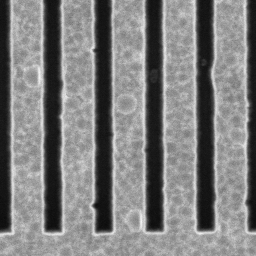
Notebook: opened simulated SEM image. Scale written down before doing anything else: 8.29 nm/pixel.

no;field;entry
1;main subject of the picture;parallel lines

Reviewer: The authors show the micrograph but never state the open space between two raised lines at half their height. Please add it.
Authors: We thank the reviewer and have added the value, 0.128 um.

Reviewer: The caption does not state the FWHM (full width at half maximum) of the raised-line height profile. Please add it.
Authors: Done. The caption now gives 293 nm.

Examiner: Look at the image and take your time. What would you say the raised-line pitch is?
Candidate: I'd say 0.422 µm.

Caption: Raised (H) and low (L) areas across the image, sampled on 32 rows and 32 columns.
LHHHHHLHHHHHLLHHHHLLHHHHHLLHHHHL
LHHHHHLHHHHHLLHHHHLLHHHHHLLHHHHL
LHHHHHLLHHHHLLHHHHLLHHHHHLLHHHHL
LHHHHHLLHHHHLLHHHHLLHHHHHLLHHHHL
LHHHHHLLHHHHLLHHHHLLHHHHHLLHHHHL
LHHHHHLLHHHHLLHHHHLLHHHHHLLHHHHL
LHHHHHLLHHHHLLHHHHLLHHHHHLLHHHHL
LHHHHHLLHHHHLLHHHHLLHHHHHLLHHHHL
LHHHHHLLHHHHLLHHHHLLHHHHHLHHHHHL
LHHHHHLLHHHHLLHHHHLLHHHHHLHHHHHL
LHHHHHLLHHHHLLHHHHLLHHHHHLHHHHHL
LHHHHHLLHHHHLLHHHHLLHHHHHLLHHHHL
LHHHHLLLHHHHLLHHHHLLHHHHHLLHHHHL
LHHHHLLLHHHHLLHHHHLLHHHHHLLHHHHL
LHHHHHLHHHHHLLHHHHLLHHHHHLLHHHHL
LHHHHHLLHHHHLLHHHHLLHHHHHLLHHHHL
LHHHHHLLHHHHLLHHHHLLHHHHHLLHHHHL
LHHHHHLLHHHHLLHHHHLLHHHHHLLHHHHL
LHHHHHLLHHHHLLHHHHLLHHHHHLLHHHHL
LHHHHHLLHHHHLLHHHHLLHHHHHLLHHHHL
LHHHHHLLHHHHLLHHHHLLHHHHHLLHHHHL
LHHHHHLLHHHHLLHHHHLLHHHHHLLHHHHL
LHHHHHLLHHHHLLHHHHLLHHHHHLLHHHHL
LHHHHHLLHHHHLLHHHHLLHHHHHLLHHHHL
LHHHHHLLHHHHLLHHHHLLHHHHHLLHHHHL
LHHHHHLLHHHHLLHHHHLLHHHHHLLHHHHL
LHHHHHLLHHHHLLHHHHLLHHHHHLLHHHHL
LHHHHHLLHHHHLLHHHHLLHHHHHLLHHHHL
LHHHHHLLHHHHLLHHHHLLHHHHHLLHHHHL
HHHHHHHHHHHHHHHHHHHHHHHHHHHHHHHH
HHHHHHHHHHHHHHHHHHHHHHHHHHHHHHHH
HHHHHHHHHHHHHHHHHHHHHHHHHHHHHHHH